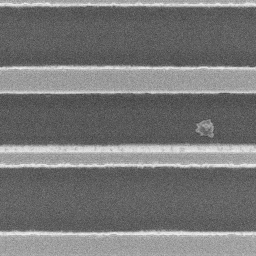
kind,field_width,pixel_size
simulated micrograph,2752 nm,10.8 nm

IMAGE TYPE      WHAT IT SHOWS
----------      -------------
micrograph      lines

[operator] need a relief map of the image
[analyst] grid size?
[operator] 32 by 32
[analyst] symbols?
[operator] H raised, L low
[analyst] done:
HHHHHHHHHHHHHHHHHHHHHHHHHHHHHHHH
LLLLLLLLLLLLLLLLLLLLLLLLLLLLLLLL
LLLLLLLLLLLLLLLLLLLLLLLLLLLLLLLL
LLLLLLLLLLLLLLLLLLLLLLLLLLLLLLLL
LLLLLLLLLLLLLLLLLLLLLLLLLLLLLLLL
LLLLLLLLLLLLLLLLLLLLLLLLLLLLLLLL
LLLLLLLLLLLLLLLLLLLLLLLLLLLLLLLL
LLLLLLLLLLLLLLLLLLLLLLLLLLLLLLLL
LLLLLLLLLLLLLLLLLLLLLLLLLLLLLLLL
HHHHHHHHHHHHHHHHHHHHHHHHHHHHHHHH
HHHHHHHHHHHHHHHHHHHHHHHHHHHHHHHH
HHHHHHHHHHHHHHHHHHHHHHHHHHHHHHHH
LLLLLLLLLLLLLLLLLLLLLLLLLLLLLLLL
LLLLLLLLLLLLLLLLLLLLLLLLLLLLLLLL
LLLLLLLLLLLLLLLLLLLLLLLLLLLLLLLL
LLLLLLLLLLLLLLLLLLLLLLLLLLLLLLLL
LLLLLLLLLLLLLLLLLLLLLLLLLLLLLLLL
LLLLLLLLLLLLLLLLLLLLLLLLLLLLLLLL
LLLLLLLLLLLLLLLLLLLLLLLLLLLLLLLL
HHHHHHHHHHHHHHHHHHHHHHHHHHHHHHHH
HHHHHHHHHHHHHHHHHHHHHHHHHHHHHHHH
LLLLLLLLLLLLLLLLLLLLLLLLLLLLLLLL
LLLLLLLLLLLLLLLLLLLLLLLLLLLLLLLL
LLLLLLLLLLLLLLLLLLLLLLLLLLLLLLLL
LLLLLLLLLLLLLLLLLLLLLLLLLLLLLLLL
LLLLLLLLLLLLLLLLLLLLLLLLLLLLLLLL
LLLLLLLLLLLLLLLLLLLLLLLLLLLLLLLL
LLLLLLLLLLLLLLLLLLLLLLLLLLLLLLLL
LLLLLLLLLLLLLLLLLLLLLLLLLLLLLLLL
HHHHHHHHHHHHHHHHHHHHHHHHHHHHHHHH
HHHHHHHHHHHHHHHHHHHHHHHHHHHHHHHH
HHHHHHHHHHHHHHHHHHHHHHHHHHHHHHHH